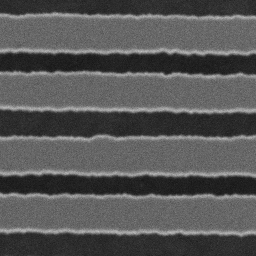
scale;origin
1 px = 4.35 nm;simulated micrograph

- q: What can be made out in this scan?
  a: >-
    lines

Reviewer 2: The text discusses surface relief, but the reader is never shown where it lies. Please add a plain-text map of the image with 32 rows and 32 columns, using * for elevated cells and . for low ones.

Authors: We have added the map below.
................................
................................
********************************
********************************
********************************
********************************
**.*****************.***********
................................
................................
********************************
********************************
********************************
********************************
********************************
................................
................................
................................
********************************
********************************
********************************
********************************
********************************
................................
................................
*****************.**.******.****
********************************
********************************
********************************
********************************
................................
................................
................................